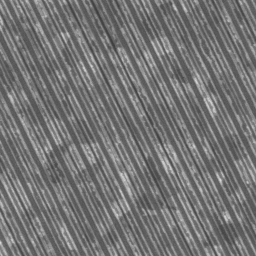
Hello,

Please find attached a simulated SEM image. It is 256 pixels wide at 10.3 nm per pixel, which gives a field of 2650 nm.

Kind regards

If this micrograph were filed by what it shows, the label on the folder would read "parallel lines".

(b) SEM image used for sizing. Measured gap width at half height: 51.1 nm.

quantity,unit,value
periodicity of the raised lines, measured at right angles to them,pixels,10.8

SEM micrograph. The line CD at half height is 5.95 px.